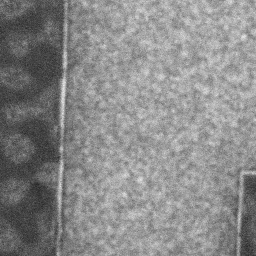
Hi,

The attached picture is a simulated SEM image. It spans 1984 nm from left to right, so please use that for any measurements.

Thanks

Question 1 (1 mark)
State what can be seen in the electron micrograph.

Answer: one or a few lines or trenches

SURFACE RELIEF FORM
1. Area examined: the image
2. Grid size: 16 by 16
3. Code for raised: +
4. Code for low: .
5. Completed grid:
++++............
++++............
++++............
++++............
++++............
++++............
++++............
++++............
++++............
++++............
++++............
++++...........+
++++...........+
++++...........+
++++...........+
++++...........+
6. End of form